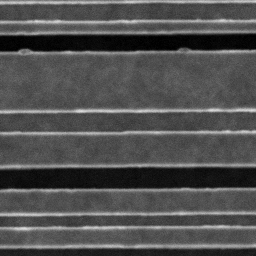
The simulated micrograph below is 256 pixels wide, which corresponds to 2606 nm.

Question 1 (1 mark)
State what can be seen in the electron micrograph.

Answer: lines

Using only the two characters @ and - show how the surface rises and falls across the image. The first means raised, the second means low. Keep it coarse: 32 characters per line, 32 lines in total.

@@@@@@@@@@@@@@@@@@@@@@@@@@@@@@@@
@@@@@@@@@@@@@@@@@@@@@@@@@@@@@@@@
@@@@@@@@@@@@@@@@@@@@@@@@@@@@@@@@
@@@@@@@@@@@@@@@@@@@@@@@@@@@@@@@@
--------------------------------
--------------------------------
--@@----@-@@-----@@@@@@@@@@@@@@@
@@@@@@@@@@@@@@@@@@@@@@@@@@@@@@@@
@@@@@@@@@@@@@@@@@@@@@@@@@@@@@@@@
@@@@@@@@@@@@@@@@@@@@@@@@@@@@@@@@
@@@@@@@@@@@@@@@@@@@@@@@@@@@@@@@@
@@@@@@@@@@@@@@@@@@@@@@@@@@@@@@@@
@@@@@@@@@@@@@@@@@@@@@@@@@@@@@@@@
@@@@@@@@@@@@@@@@@@@@@@@@@@@@@@@@
@@@@@@@@@@@@@@@@@@@@@@@@@@@@@@@@
@@@@@@@@@@@@@@@@@@@@@@@@@@@@@@@@
@@@@@@@@@@@@@@@@@@@@@@@@@@@@@@@@
@@@@@@@@@@@@@@@@@@@@@@@@@@@@@@@@
@@@@@@@@@@@@@@@@@@@@@@@@@@@@@@@@
@@@@@@@@@@@@@@@@@@@@@@@@@@@@@@@@
@@@@@@@@@@@@@@@@@@@@@@@@@@@@@@@@
--------------------------------
--------------------------------
--------------------------------
@@@@@@@@@@@@@@@@@@@@@@@@@@@@@@@@
@@@@@@@@@@@@@@@@@@@@@@@@@@@@@@@@
@@@@@@@@@@@@@@@@@@@@@@@@@@@@@@@@
@@@@@@@@@@@@@@@@@@@@@@@@@@@@@@@@
@@@@@@@@@@@@@@@@@@@@@@@@@@@@@@@@
@@@@@@@@@@@@@@@@@@@@@@@@@@@@@@@@
@@@@@@@@@@@@@@@@@@@@@@@@@@@@@@@@
--------------------------------